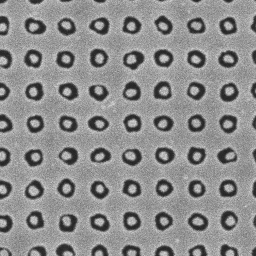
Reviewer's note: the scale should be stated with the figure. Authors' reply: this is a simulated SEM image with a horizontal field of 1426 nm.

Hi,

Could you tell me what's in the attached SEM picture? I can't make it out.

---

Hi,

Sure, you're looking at a regular array of ring-shaped grooves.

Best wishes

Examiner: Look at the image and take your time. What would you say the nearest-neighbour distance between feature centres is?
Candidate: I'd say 172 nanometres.